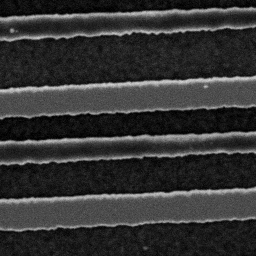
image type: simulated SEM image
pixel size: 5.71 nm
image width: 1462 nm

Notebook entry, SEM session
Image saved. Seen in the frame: lines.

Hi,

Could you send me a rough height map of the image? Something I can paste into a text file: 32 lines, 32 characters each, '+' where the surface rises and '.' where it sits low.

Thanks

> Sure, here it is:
................................
..................++++++++++++++
++++++++++++++++++++++++++++++++
++++++++++++++++++++++++++++.++.
++++++++++++....................
................................
................................
................................
................................
................................
...............+++++++++++++++++
++++++++++++++++++++++++++++++++
++++++++++++++++++++++++++++++++
+++++++++++++++++++++++++++.....
+++++...........................
................................
................................
.....+++++++++++++++++++++++++++
++++++++++++++++++++++++++++++++
+++++++++++++++++++++++.........
................................
................................
................................
................................
............++++++++++++++++++++
++++++++++++++++++++++++++++++++
++++++++++++++++++++++++++++++++
+++++++++++++++++++++++++++++...
+++++++.+.......................
................................
................................
................................